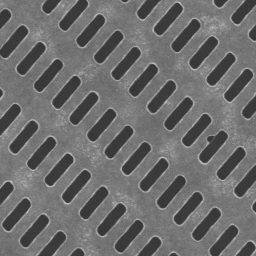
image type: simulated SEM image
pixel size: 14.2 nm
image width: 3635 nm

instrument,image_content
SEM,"a regular array of holes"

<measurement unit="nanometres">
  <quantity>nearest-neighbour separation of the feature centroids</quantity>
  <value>342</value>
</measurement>